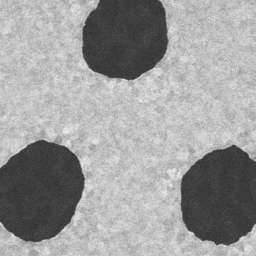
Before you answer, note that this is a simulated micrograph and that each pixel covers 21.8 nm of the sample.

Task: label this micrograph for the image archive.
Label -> holes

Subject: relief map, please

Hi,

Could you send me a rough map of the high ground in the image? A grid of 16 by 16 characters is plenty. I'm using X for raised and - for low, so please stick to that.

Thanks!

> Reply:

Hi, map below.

XXXXXX----XXXXXX
XXXXX-----XXXXXX
XXXXX------XXXXX
XXXXX-----XXXXXX
XXXXXX---XXXXXXX
XXXXXXXXXXXXXXXX
XXXXXXXXXXXXXXXX
XXXXXXXXXXXXXXXX
XXXXXXXXXXXXXXXX
X----XXXXXXXX--X
-----XXXXXXX----
-----XXXXXX-----
-----XXXXXX-----
-----XXXXXX-----
X---XXXXXXXX----
XXXXXXXXXXXXXXXX